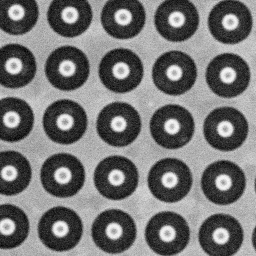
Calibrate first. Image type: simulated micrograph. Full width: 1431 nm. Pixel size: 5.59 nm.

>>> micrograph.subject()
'an array of small figures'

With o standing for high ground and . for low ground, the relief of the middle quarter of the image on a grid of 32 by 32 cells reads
oo....ooo....oo.....oo..........
oo.....o.....ooo....oo....ooo...
o.....oo.....ooo....oo....ooo...
......ooo...........oo.....o....
.....oooo..........ooo..........
.....ooooo........ooooo.........
...oooooooo.......oooooo........
ooooooooooooo..oooooooooo.....oo
oooooooooooooooooooooooooooooooo
...ooooooooo...ooooooooooooooooo
....oooooo.......ooooooo......oo
.....oooo.........ooooo........o
......oo...........ooo..........
o.....oo...........ooo..........
oo....oo....ooo....oo.....oo....
oo....oo....ooo....oo.....oo....
......oo.....o.....oo.....oo....
.....ooo...........ooo..........
....ooooo.........oooo..........
...ooooooo.......oooooo........o
oooooooooooo....oooooooo......oo
oooooooooooooooooooooooooooooooo
..oooooooooooooooooooooooooooooo
...ooooooo......ooooooooo...oooo
....ooooo........oooooo.......oo
.....ooo..........oooo.........o
o....ooo..........ooo...........
o.....o.....oo.....oo...........
o....oo.....ooo....oo....ooo....
.....oo.....oo.....oo....ooo....
.....ooo..........ooo...........
....oooo..........ooo...........